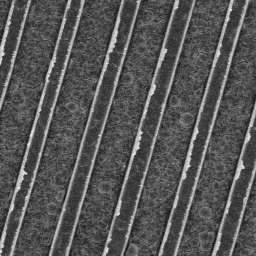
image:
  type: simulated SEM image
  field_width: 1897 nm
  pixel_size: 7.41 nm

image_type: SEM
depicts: parallel lines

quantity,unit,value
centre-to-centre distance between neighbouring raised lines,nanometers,388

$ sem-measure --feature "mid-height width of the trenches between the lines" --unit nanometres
266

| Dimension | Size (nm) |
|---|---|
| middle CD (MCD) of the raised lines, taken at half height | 115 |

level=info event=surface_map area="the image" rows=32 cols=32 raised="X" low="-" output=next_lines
--XX----XX-----XX-----XX-----XX-
-XX-----XX-----XX-----XX-----XX-
-XX-----XX-----XX----XXX----XX--
-XX-----XX----XX-----XX-----XX--
XXX----XX-----XX-----XX-----XX--
XX-----XX-----XX----XXX----XX---
XX-----XX-----XX----XX-----XX---
XX-----X-----XX-----XX-----XX---
X-----XX-----XX-----XX-----XX---
X-----XX-----XX----XXX----XX----
X-----XX----XXX----XX-----XX----
X----XX-----XX-----XX-----XX----
-----XX-----XX----XXX----XX-----
-----XX-----XX----XX-----XX-----
-----X-----XX-----XX-----XX-----
----XX-----XX-----XX-----XX----X
----XX-----XX----XXX----XX-----X
----XX----XXX----XX-----XX-----X
---XX-----XX-----XX-----XX----XX
---XX-----XX-----XX----XX-----XX
---XX-----XX----XX-----XX-----XX
---X-----XX-----XX-----XX-----XX
--XX-----XX-----XX-----XX----XXX
--XX-----XX----XXX----XX-----XX-
--XX----XX-----XX-----XX-----XX-
-XX-----XX-----XX-----XX----XXX-
-XX-----XX-----XX----XX-----XX--
-XX-----XX----XXX----XX-----XX--
-X-----XX-----XX-----XX-----XX--
XX-----XX-----XX-----XX----XXX--
XX-----XX----XXX----XX-----XX---
X-----XXX----XX-----XX-----XX---